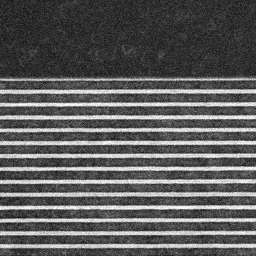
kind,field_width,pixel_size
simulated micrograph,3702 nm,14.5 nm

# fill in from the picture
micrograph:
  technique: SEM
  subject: parallel lines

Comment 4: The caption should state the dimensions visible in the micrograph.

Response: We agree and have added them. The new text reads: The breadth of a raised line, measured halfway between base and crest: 3 pixels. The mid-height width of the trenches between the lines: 141 nanometres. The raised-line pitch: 186 nanometers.